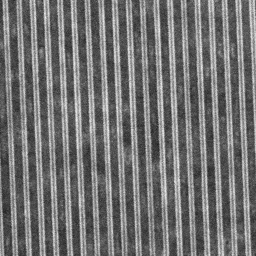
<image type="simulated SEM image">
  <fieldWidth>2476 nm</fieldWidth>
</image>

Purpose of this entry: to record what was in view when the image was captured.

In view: parallel lines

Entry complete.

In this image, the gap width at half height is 0.0869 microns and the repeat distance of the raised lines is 0.133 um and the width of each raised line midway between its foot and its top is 0.0386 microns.